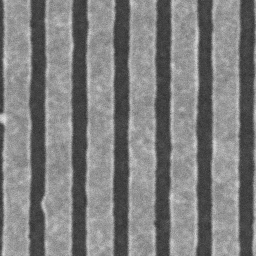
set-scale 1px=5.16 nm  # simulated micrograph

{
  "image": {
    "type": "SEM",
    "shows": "parallel lines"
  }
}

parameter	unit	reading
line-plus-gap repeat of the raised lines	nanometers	216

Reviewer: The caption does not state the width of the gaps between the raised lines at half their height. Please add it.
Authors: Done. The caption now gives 84.6 nm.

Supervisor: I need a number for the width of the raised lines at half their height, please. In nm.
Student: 129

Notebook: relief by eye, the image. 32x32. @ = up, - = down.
-@@@--@@@--@@@--@@@---@@@--@@@--
-@@@--@@@--@@@--@@@---@@@--@@@--
-@@@--@@@--@@@--@@@---@@@--@@@--
-@@@--@@@--@@@--@@@---@@@--@@@--
-@@@--@@@--@@@--@@@---@@@--@@@--
-@@@--@@@--@@@--@@@---@@@--@@@--
-@@@--@@@--@@@--@@@---@@@--@@@--
-@@@--@@@--@@@--@@@---@@@--@@@--
-@@@--@@@--@@@--@@@---@@@--@@@--
-@@@--@@@--@@@--@@@---@@@--@@@--
-@@@--@@@--@@@--@@@---@@@--@@@--
-@@@--@@@--@@@--@@@---@@@--@@@--
-@@@--@@@--@@@--@@@---@@@--@@@--
-@@@--@@@--@@@--@@@---@@@--@@@--
@@@@--@@@--@@@--@@@--@@@@--@@@--
@@@@--@@@--@@@--@@@--@@@---@@@--
-@@@--@@@--@@@--@@@--@@@---@@@--
-@@@--@@@--@@@--@@@---@@---@@@--
-@@@--@@@--@@@--@@@---@@---@@@--
@@@@--@@@--@@@--@@@--@@@---@@@--
@@@@--@@@--@@@--@@@--@@@---@@@--
@@@@--@@@--@@@--@@@--@@@---@@@--
-@@@--@@@--@@@--@@@--@@@---@@@--
-@@@--@@@--@@@--@@@--@@@---@@@--
-@@@--@@@--@@@--@@@--@@@@--@@@--
-@@@-@@@@--@@@--@@@--@@@---@@@--
-@@---@@@--@@@--@@@--@@@@--@@@--
-@@---@@@--@@@--@@@--@@@@--@@@--
-@@@--@@@--@@@--@@@--@@@@--@@@--
@@@---@@@--@@@--@@@--@@@@--@@@--
@@@@--@@@--@@@--@@@--@@@---@@@--
@@@@--@@@--@@@--@@@--@@@---@@@--